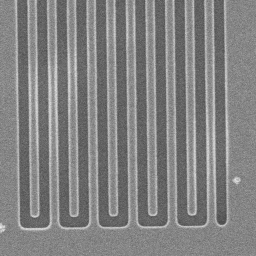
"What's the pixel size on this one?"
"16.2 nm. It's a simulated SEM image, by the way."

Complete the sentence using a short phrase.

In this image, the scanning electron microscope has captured groups of lines, slits or small figures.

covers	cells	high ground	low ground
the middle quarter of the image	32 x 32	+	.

.++...++...++...++...++...++...+
.++...++...++...++...++...++...+
.++...++...++...++...++...++...+
.++...++...++...++...++...++...+
.++...++...++...++...++...++...+
.++...++...++...++...++...++...+
.++...++...++...++...++...++...+
.++...++...++...++...++...++...+
.++...++...++...++...++...++...+
.++...++...++...++...++...++...+
.++...++...++...++...++...++...+
.++...++...++...++...++...++...+
.++...++...++...++...++...++...+
.++...++...++...++...++...++...+
.++...++...++...++...++...++...+
.++...++...++...++...++...++...+
.++...++...++...++...++...++...+
.++...++...++...++...++...++...+
.++...++...++...++...++...++...+
.++...++...++...++...++...++...+
.++...++...++...++...++...++...+
.++...++...++...++...++...++...+
.++...++...++...++...++...++...+
.++...++...++...++...++...++...+
.++...++...++...++...++...++...+
.++...++...++...++...++...++...+
.++...++...++...++...++...++...+
.++...++...++...++...++...++...+
.++...++...++...++...++...++...+
.++...++...++...++...++...++...+
.++...++...++...++...++...++...+
.++...++...++...++...++...++...+